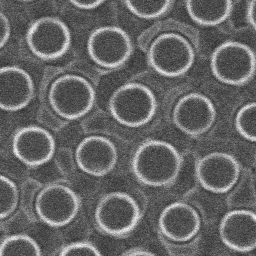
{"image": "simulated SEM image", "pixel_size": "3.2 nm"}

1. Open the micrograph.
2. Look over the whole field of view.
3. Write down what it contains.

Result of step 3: a regular array of raised bodies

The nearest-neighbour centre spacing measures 0.198 um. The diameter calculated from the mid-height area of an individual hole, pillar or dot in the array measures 131 nanometres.